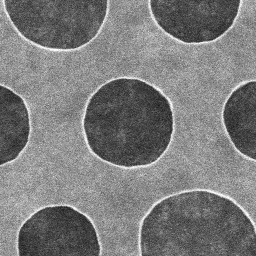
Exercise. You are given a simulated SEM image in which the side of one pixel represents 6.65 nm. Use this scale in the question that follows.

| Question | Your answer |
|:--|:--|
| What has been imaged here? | holes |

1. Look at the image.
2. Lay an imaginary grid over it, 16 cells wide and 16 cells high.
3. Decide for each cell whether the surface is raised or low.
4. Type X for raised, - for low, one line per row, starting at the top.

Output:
-------XX------X
X-----XXXX----XX
XX----XXXXX--XXX
XXXXXXXXXXXXXXXX
XXXXXXXXXXXXXXXX
XXXXXX----XXXXX-
--XXXX-----XXX--
--XXX------XXX--
--XXX------XXX--
-XXXXX----XXXXX-
XXXXXXXXXXXXXXXX
XXXXXXXXXXXXXXXX
XXXXXXXXXX----XX
XX---XXXX------X
X-----XXX-------
X-----XXX-------